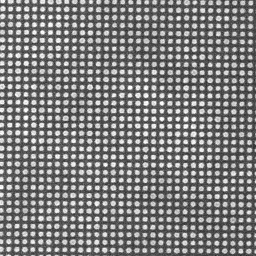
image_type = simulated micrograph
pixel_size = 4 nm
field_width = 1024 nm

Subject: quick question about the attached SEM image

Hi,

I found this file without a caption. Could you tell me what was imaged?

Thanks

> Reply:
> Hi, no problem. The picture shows a regular array of raised bodies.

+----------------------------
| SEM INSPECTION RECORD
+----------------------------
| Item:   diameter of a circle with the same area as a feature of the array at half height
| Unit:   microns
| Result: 0.018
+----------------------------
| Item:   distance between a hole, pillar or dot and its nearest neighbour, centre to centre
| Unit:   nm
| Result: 30.7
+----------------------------